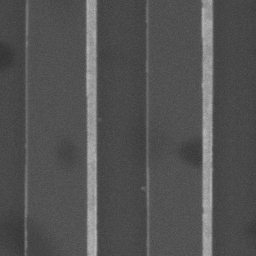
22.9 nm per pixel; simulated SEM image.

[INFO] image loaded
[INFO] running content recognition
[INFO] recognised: lines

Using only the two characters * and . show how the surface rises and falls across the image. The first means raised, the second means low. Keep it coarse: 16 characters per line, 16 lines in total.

..****...****...
..****...****...
..****...****...
..****...****...
..****...****...
..****...****...
..****...****...
..****...****...
..****...****...
..****...****...
..****...****...
..****...****...
..****...****...
..****...****...
..****...****...
..****...****...